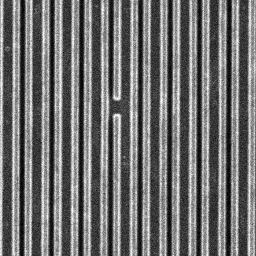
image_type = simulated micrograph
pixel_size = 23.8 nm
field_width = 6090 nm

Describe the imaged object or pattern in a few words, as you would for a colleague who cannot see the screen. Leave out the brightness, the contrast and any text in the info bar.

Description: parallel lines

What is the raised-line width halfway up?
160 nm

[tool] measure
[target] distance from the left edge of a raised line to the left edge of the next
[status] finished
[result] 0.349 micrometres